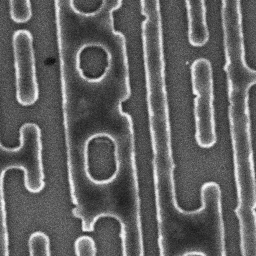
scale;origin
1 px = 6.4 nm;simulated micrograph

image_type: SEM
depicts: parallel lines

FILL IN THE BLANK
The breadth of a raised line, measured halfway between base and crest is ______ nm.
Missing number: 116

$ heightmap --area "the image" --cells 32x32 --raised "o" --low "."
.ooo...oo....oo...oo...ooo..oo..
.ooo...ooo..oo....oo...ooo..oo..
..o....ooooooo....oo....oo..oo..
.......ooooooo....oo....oo..oo..
..oo...oooooooo...oo....oo..oo..
..oo...ooooooooo..oo....o...oo..
..oo...ooo...ooo..oo........oo..
..oo....oo....oo..oo.....o..ooo.
..oo....oo...ooo..oo....oo..ooo.
..oo....ooo..ooo..oo....oo..oooo
..ooo...oooooooo..ooo...oo...ooo
..ooo...oooooooo..ooo...ooo..oo.
..oo....ooooooo...ooo...ooo..oo.
........ooooooo....oo...ooo..oo.
........oooooooo...oo...ooo..oo.
...o....oooooooo...oo....oo..oo.
...oo...ooooooooo..oo....oo..oo.
...oo...ooo...ooo..oo....oo..oo.
o.ooo...ooo...ooo..oo........oo.
ooooo...ooo...ooo..oo........oo.
ooooo....oo....oo..ooo.......ooo
o..oo....oo...ooo..ooo.......ooo
...oo....ooo.oooo..ooo........oo
...oo....oooooooo..ooo...oo...oo
.........oooooooo..ooo...ooo..oo
o........oooooooo...oo...ooo..oo
o........oooooooo...oooooooo..oo
o.........oo...oo...oooooooo..oo
o.........oo...ooo..oooooooo..oo
o...oo.........ooo..oooooooo..oo
o...oo....oo...ooo..oooooooo..oo
o...oo....oo...ooo..oooooooo..oo